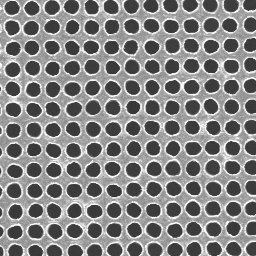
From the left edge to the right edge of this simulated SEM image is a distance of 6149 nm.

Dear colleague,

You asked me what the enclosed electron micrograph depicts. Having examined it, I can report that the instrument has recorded a regular array of holes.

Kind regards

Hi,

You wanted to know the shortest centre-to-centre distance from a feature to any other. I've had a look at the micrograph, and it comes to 467 nanometres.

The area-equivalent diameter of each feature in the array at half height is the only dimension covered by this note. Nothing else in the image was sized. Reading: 353 nanometres